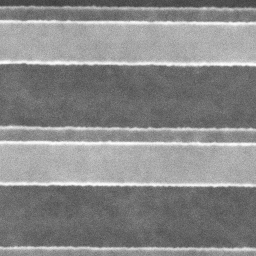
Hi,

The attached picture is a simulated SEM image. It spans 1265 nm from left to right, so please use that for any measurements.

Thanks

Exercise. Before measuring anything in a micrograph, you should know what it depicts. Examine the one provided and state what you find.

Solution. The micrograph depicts lines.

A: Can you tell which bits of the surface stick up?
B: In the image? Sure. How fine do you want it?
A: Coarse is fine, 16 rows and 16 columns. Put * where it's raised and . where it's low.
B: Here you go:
................
****************
****************
****************
................
................
................
................
................
****************
****************
****************
................
................
................
................